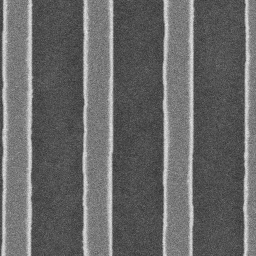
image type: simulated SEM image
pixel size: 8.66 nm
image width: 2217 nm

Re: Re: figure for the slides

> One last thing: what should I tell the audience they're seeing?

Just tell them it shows lines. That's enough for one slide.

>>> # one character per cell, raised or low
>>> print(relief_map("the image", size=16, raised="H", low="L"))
HHLLLHHLLLHHLLLH
HHLLLHHLLLHHLLLH
HHLLLHHLLLHHLLLH
HHLLLHHLLLHHLLLH
HHLLLHHLLLHHLLLH
HHLLLHHLLLHHLLLH
HHLLLHHLLLHHLLLH
HHLLLHHLLLHHLLLH
HHLLLHHLLLHHLLLH
HHLLLHHLLLHHLLLH
HHLLLHHLLLHHLLLH
HHLLLHHLLLHHLLLH
HHLLLHHLLLHHLLLH
HHLLLHHLLLHHLLLH
HHLLLHHLLLHHLLLH
HHLLLHHLLLHHLLLH